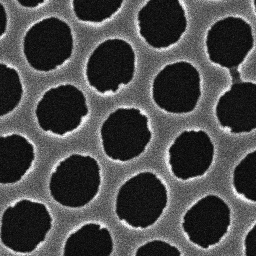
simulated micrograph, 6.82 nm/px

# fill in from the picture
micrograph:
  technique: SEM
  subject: a regular array of holes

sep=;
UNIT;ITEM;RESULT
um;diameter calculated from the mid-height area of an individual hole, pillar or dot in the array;0.345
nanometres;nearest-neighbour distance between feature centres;461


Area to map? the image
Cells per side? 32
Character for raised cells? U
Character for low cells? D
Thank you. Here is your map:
UUUDDUUUUDDDDDDUUUDDDDDUUUUUUUUU
DUUUUUUUUDDDDDUUUDDDDDDUUUUUUUUU
DUUUUDDDUUDDDUUUUDDDDDDUUUUUDDUU
DUUUDDDDDUUUUUUUUDDDDDDUUUDDDDDU
UUUDDDDDDUUUUUUUUUDDDDDUUUDDDDDD
UUUDDDDDDUUUUDDDUUUDDDUUUUDDDDDD
UUUDDDDDDUUUDDDDDUUUUUUUUUDDDDDU
UUUDDDDDUUUDDDDDDUUUUUUUUUDDDDUU
DUUUDDDUUUUDDDDDDUUUUDDDUUUUDDUU
DDUUUUUUUUUDDDDDDUUUDDDDDUUUUDUU
DDDUUUUUUUUDDDDUUUUDDDDDDUUUUDDD
DDDUUUDDDDUUUUUUUUUDDDDDDUUUDDDD
DDDUUDDDDDDUUUUUUUUDDDDDDUUDDDDD
DDUUUDDDDDDUUUUUUUUUDDDDUUUDDDDD
UUUUUDDDDDUUUUDDDDUUUUUUUUUDDDDD
UUUUUDDDDDUUUDDDDDUUUUUUUUUUDDDD
UUUUUUUDUUUUUDDDDDDUUUUDDDUUUDDU
DDDUUUUUUUUUUDDDDDDUUUDDDDUUUUUU
DDDDUUUUUUUUUDDDDDUUUDDDDDDUUUUU
DDDDUUUUUDDUUUDDDUUUUDDDDDDUUUUD
DDDDUUUDDDDDUUUUUUUUUDDDDDUUUUDD
DDDUUUUDDDDDUUUUUUUUUUDDDDUUUDDD
DDUUUUDDDDDDDUUUDDDDUUUUUUUUUDDD
UUUUUUDDDDDDUUUDDDDDDUUUUUUUUDDD
UUUUUUUDDDDDUUUDDDDDDUUUUUDUUUUD
UUDDDUUUDDDUUUUDDDDDDUUUDDDDUUUU
UDDDDDUUUUUUUUUDDDDDUUUDDDDDDUUU
DDDDDDUUUUUUUUUDDDDDUUUDDDDDDUUU
DDDDDDUUUUDDDUUUUUUUUUUDDDDDUUUU
DDDDDDUUUDDDDDUUUUUUUUUUDDDDUUUD
DDDDDUUUDDDDDDUUUUDDDUUUDDDUUUUD
UUDDUUUUDDDDDDUUUDDDDDUUUUUUUUUD